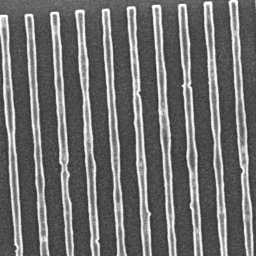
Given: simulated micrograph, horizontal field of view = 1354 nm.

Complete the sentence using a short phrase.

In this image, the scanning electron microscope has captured parallel lines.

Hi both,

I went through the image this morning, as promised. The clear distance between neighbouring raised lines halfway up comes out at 96.9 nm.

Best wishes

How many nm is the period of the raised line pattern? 135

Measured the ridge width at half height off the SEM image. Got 36.9 nm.